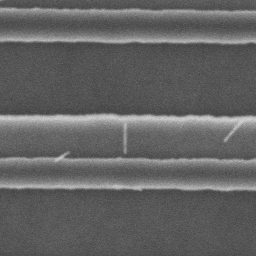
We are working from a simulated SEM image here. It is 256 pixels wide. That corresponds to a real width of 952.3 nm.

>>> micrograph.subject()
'lines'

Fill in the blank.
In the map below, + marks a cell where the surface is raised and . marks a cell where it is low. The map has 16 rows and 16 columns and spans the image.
++++++++++++++++
++++++++++++++++
++++++++++++++++
................
................
................
................
++++++++++++++++
++++++++++++++++
++++++++++++++++
++++++++++++++++
++++++++++++++++
................
................
................
................